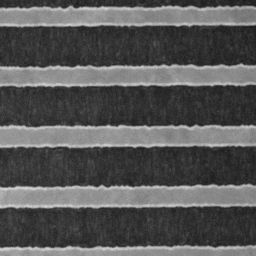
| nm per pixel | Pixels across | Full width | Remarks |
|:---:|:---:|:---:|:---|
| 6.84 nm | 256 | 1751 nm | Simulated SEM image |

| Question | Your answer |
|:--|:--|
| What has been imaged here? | lines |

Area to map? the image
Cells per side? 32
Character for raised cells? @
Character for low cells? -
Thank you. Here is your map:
--------------------------------
@@@@@@@@@@@@@@@@@@@@@@@@@@@@@@@@
@@@@@@@@@@@@@@@@@@@@@@@@@@@@@@@@
--------------------------------
--------------------------------
--------------------------------
--------------------------------
--------------------------------
@@@@@@@@@@@@@@@@@@@@@@@@@@@@@@@@
@@@@@@@@@@@@@@@@@@@@@@@@@@@@@@@@
@@@@@@@@@@@@@@@@@@@@@@@@@@@@@@@@
--------------------------------
--------------------------------
--------------------------------
--------------------------------
--------------------------------
@@@@@@@@@@@@@@@@@@@@@@@@@@@@@@@@
@@@@@@@@@@@@@@@@@@@@@@@@@@@@@@@@
--------------------------------
--------------------------------
--------------------------------
--------------------------------
--------------------------------
--@@---@@@@@@@@@@@@@@@@@@@@@@@@@
@@@@@@@@@@@@@@@@@@@@@@@@@@@@@@@@
@@@@@@@@@@@@@@@@@@@@@@@@@@@@@@@@
--------------------------------
--------------------------------
--------------------------------
--------------------------------
--------------------------------
@@@@@@@@@@@@@@@@@@@@@@@@@@@@@@@@